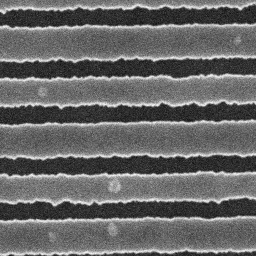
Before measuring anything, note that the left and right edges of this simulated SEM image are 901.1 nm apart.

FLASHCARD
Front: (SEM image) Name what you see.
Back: lines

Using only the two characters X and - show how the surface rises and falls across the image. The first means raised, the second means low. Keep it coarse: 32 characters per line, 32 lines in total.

XXXXXXXXXXXXXXXXXXXXXXXXXXXXXXXX
--------------------------------
--------------------------------
XXXXXXXXXXXXXXXXXXXXXXXXXXXXXXXX
XXXXXXXXXXXXXXXXXXXXXXXXXXXXXXXX
XXXXXXXXXXXXXXXXXXXXXXXXXXXXXXXX
XXXXXXXXXXXXXXXXXXXXXXXXXXXXXXXX
XXXXXX--XX---X------------------
--------------------------------
--------------------X----XXXXXXX
XXXXXXXXXXXXXXXXXXXXXXXXXXXXXXXX
XXXXXXXXXXXXXXXXXXXXXXXXXXXXXXXX
XXXXXXXXXXXXXXXXXXXXXXXXXXXXXXXX
--------------------------------
--------------------------------
---X-XXXXXXXXXXXXXXXXXXXXXXXXXXX
XXXXXXXXXXXXXXXXXXXXXXXXXXXXXXXX
XXXXXXXXXXXXXXXXXXXXXXXXXXXXXXXX
XXXXXXXXXXXXXXXXXXXXXXXXXXXXXXXX
XXXXXXXXXXXX-X-X---XX--X--------
--------------------------------
-------------------------X------
XXXXXXXXXXXXXXXXXXXXXXXXXXXXXXXX
XXXXXXXXXXXXXXXXXXXXXXXXXXXXXXXX
XXXXXXXXXXXXXXXXXXXXXXXXXXXXXXXX
--------------------------------
--------------------------------
---XXXXXXXXXXXXXXXXXXXXXXXXXXXXX
XXXXXXXXXXXXXXXXXXXXXXXXXXXXXXXX
XXXXXXXXXXXXXXXXXXXXXXXXXXXXXXXX
XXXXXXXXXXXXXXXXXXXXXXXXXXXXXXXX
XXXXXXXXXXXXXX-X-X--XX----------